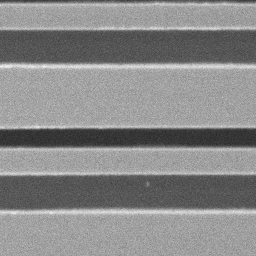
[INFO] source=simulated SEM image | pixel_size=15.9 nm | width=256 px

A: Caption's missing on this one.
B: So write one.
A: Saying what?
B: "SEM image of lines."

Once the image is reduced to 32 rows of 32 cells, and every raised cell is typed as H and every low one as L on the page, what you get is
LLLLLLLLLLLLLLHLLHHHHHLHHHLHHLLL
HHHHHHHHHHHHHHHHHHHHHHHHHHHHHHHH
HHHHHHHHHHHHHHHHHHHHHHHHHHHHHHHH
HHHHHHHHHHHHHHHHHHHHHHHHHHHHHHHH
LLLLLLLLLLLLLLLLLLLLLLLLLLLLLLLL
LLLLLLLLLLLLLLLLLLLLLLLLLLLLLLLL
LLLLLLLLLLLLLLLLLLLLLLLLLLLLLLLL
LLLLLLLLLLLLLLLLLLLLLLLLLLLLLLLL
HHHHHHHHHHHHHHHHHHHHHHHHHHHHHHHH
HHHHHHHHHHHHHHHHHHHHHHHHHHHHHHHH
HHHHHHHHHHHHHHHHHHHHHHHHHHHHHHHH
HHHHHHHHHHHHHHHHHHHHHHHHHHHHHHHH
HHHHHHHHHHHHHHHHHHHHHHHHHHHHHHHH
HHHHHHHHHHHHHHHHHHHHHHHHHHHHHHHH
HHHHHHHHHHHHHHHHHHHHHHHHHHHHHHHH
HHHHHHHHHHHHHHHHHHHHHHHHHHHHHHHH
LLLLLLLLLLLLLLLLLLLLLLLLLLLLLLLL
LLLLLLLLLLLLLLLLLLLLLLLLLLLLLLLL
LLLLLLLLLLLLLLLLLLLLLLLLLLLLLLLL
HHHHHHHHHHHHHHHHHHHHHHHHHHHHHHHH
HHHHHHHHHHHHHHHHHHHHHHHHHHHHHHHH
HHHHHHHHHHHHHHHHHHHHHHHHHHHHHHHH
LLLLLLLLLLLLLLLLLLLLLLLLLLLLLLLL
LLLLLLLLLLLLLLLLLLLLLLLLLLLLLLLL
LLLLLLLLLLLLLLLLLLLLLLLLLLLLLLLL
LLLLLLLLLLLLLLLLLLLLLLLLLLLLLLLL
LLLLLLLLLLLLLLLLLLLLLLLLLLLLLLLL
HHHHHHHHHHHHHHHHHHHHHHHHHHHHHHHH
HHHHHHHHHHHHHHHHHHHHHHHHHHHHHHHH
HHHHHHHHHHHHHHHHHHHHHHHHHHHHHHHH
HHHHHHHHHHHHHHHHHHHHHHHHHHHHHHHH
HHHHHHHHHHHHHHHHHHHHHHHHHHHHHHHH